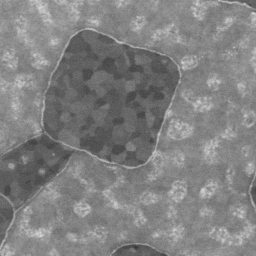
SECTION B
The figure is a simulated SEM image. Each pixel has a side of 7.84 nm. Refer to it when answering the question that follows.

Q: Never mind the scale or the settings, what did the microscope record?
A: raised bodies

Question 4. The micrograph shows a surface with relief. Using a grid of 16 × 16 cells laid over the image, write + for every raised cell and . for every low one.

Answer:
................
................
....+++.........
....++++++......
...++++++++.....
...++++++++.....
...++++++++.....
...+++++++......
..++++++++......
++++++++++......
++++............
+++.............
++..............
+...............
................
.......+++......